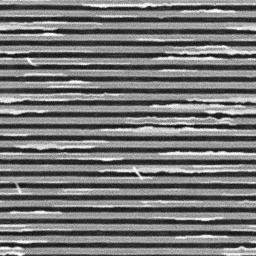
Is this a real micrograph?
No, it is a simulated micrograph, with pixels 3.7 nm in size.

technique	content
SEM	parallel lines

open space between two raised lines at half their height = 19.4 nanometers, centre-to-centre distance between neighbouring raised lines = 11.9 pixels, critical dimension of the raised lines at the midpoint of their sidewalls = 0.0226 µm